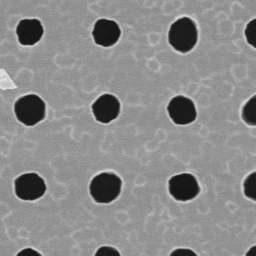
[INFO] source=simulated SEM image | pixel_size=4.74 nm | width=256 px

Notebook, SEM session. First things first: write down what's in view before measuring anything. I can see a regular array of holes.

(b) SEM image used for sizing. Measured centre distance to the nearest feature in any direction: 0.358 um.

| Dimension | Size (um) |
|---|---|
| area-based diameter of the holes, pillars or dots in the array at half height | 0.135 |